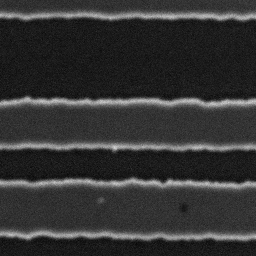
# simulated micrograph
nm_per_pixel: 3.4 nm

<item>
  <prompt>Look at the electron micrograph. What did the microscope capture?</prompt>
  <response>lines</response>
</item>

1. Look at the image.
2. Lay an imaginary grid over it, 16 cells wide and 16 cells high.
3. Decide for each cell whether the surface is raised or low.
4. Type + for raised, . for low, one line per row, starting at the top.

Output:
++++++++++++++++
................
................
................
................
................
++++++++++++++++
++++++++++++++++
++++++++++++++++
................
................
++++++++++++++++
++++++++++++++++
++++++++++++++++
++++++++++++++++
................